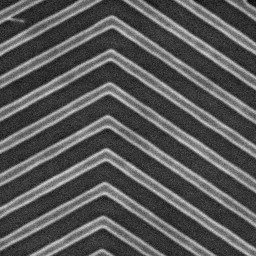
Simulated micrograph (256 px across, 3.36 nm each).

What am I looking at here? groups of lines, slits or small figures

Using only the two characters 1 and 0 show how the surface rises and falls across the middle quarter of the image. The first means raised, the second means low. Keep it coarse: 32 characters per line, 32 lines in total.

00001111100000111100000000011110
00111110000000011111000000001111
11111000000000000111100000000011
11100000000000000001111000000001
11000000000000000000111100000000
00000000001110000000011111000000
00000000111111000000000111100000
00000011110011110000000011111000
00001111100000111000000000111100
00111110000000011110000000011110
01111000000000001111000000000111
11100000000000000011110000000011
10000000000000000001111000000000
00000000001100000000011110000000
00000000111110000000001111000000
00000011111111100000000011110000
00001111100011110000000001111000
00011110000000111100000000011110
01111000000000011110000000001111
11100000000000000111100000000111
11000000000000000011110000000001
00000000000000000000111100000000
00000000111110000000011110000000
00000011111111000000000111100000
00000111100111110000000011110000
00011111000001111000000000111100
01111100000000111110000000011110
11110000000000001111000000000111
11000000000000000111110000000011
00000000000000000001111000000000
00000000111100000000111100000000
00000001111110000000001111000000